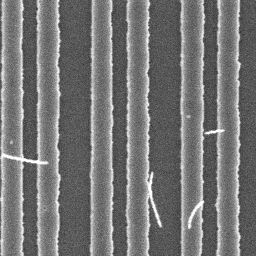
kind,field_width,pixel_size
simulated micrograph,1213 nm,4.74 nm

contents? lines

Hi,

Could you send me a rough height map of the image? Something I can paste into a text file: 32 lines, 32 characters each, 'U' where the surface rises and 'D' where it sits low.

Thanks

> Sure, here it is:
UUUDDUUDDDDDUUDDUUUDDDDUUDDUUUDD
UUUDDUUDDDDDUUDDUUUDDDDUUUDUUUDD
UUUDDUUDDDDDUUDDUUUDDDDUUUDUUUDD
UUUDDUUDDDDDUUDDUUUDDDDUUDDUUUDD
UUUDDUUDDDDDUUDDUUUDDDDUUDDUUUDD
UUUDDUUDDDDDUUDDUUUDDDDUUDDUUUDD
UUUDDUUDDDDUUUDDUUUDDDDUUDDUUUDD
UUUDDUUDDDDUUUDDUUUDDDDUUDDUUUDD
UUUDDUUDDDDDUUDDUUUDDDDUUDDUUUDD
UUUDDUUDDDDDUUDDUUUDDDDUUDDUUUDD
UUUDDUUDDDDDUUDDUUUDDDDUUDDUUUDD
UUUDDUUDDDDUUUDDUUUDDDDUUDDUUUDD
UUUDDUUDDDDUUUDDUUDDDDDUUDDUUUDD
UUUDDUUDDDDUUUDDUUUDDDDUUDDUUUDD
UUUDDUUDDDDUUUDDUUUDDDDUUDDUUUDD
UUUDDUUDDDDUUUDDUUUDDDDUUDDUUUDD
UUUDDUUDDDDUUUDDUUUDDDDUUDDUUUDD
UUUDDUUDDDDUUUDDUUUDDDDUUDDUUUDD
UUUDDUUDDDDDUUDDUUUDDDDUUDDUUUDD
UUUDDUUDDDDDUUDDUUUDDDDUUDDUUUDD
UUUDDUUDDDDUUUDDUUUDDDDUUDDUUUDD
UUUDDUUDDDDUUUDDUUUDDDDUUDDUUUDD
UUUDDUUDDDDUUUDDUUUDDDDUUDDUUUDD
UUUDDUUDDDDUUUDDUUUDDDDUUDDUUUDD
UUUDDUUDDDDUUUDDUUUDDDDUUDDUUUDD
UUUDDUUDDDDUUUDDUUUDDDDUUDDUUUDD
UUUDDUUDDDDUUUDDUUUDDDDUUDDUUUDD
UUUDDUUDDDDUUUDDUUUDDDDUUDDUUUDD
UUUDDUUDDDDUUUDDUUUDDDDUUDDUUUDD
UUUDDUUDDDDUUUDDUUUDDDDUUDDUUUDD
UUUDDUUDDDDUUUDDUUUDDDDUUDDUUUDD
UUUDDUUDDDDUUUDDUUUDDDDUUDDUUUDD